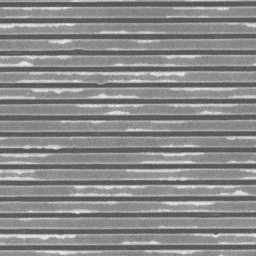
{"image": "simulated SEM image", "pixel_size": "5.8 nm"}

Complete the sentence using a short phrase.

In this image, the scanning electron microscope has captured parallel lines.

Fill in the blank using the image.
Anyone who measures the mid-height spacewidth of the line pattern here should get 34.1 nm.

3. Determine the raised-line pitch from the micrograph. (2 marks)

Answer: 94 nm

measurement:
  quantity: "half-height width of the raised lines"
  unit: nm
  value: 63.8